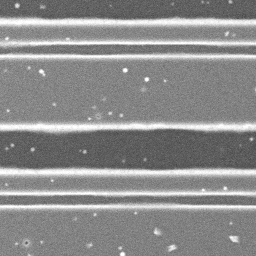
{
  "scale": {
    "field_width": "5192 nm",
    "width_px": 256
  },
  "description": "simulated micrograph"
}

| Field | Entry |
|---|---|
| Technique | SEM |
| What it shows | lines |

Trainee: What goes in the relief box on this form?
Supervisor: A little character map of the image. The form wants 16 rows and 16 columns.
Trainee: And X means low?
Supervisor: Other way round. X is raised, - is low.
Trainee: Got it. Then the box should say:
----------------
XXXXXXXXXXXXXXXX
XXXXXXXXXXXXXXXX
XXXXXXXXXXXXXXXX
XXXXXXXXXXXXXXXX
XXXXXXXXXXXXXXXX
XXXXXXXXXXXXXXXX
XXXXXXXXXXXXXXXX
----------------
----------------
----------------
XXXXXXXXXXXXXXXX
XXXXXXXXXXXXXXXX
XXXXXXXXXXXXXXXX
XXXXXXXXXXXXXXXX
XXXXXXXXXXXXXXXX